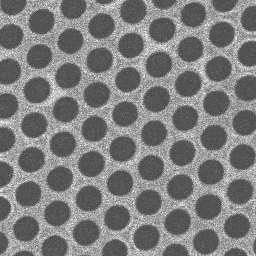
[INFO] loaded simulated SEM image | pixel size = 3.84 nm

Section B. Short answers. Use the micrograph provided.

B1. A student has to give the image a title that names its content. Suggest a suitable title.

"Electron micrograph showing a regular array of holes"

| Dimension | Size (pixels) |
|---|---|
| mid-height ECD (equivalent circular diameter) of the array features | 25.4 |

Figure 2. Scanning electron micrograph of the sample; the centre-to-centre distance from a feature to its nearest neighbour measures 132 nm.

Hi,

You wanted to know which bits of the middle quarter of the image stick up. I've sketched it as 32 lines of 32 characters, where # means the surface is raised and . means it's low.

...###......########.......#####
....###....###....###......#####
....#########......##.....###...
....#########......#########....
....#########......#########....
...###.....##......#########....
#####......###....###.....##....
#####......#########......###...
..###......#########......######
...##......####.####......######
....###..####.....##......####.#
....########......###....###....
...#########.......########.....
...###...###......#########.....
.####.....###.....###...###.....
#####......###..####.....###....
####.......########.......###..#
..###.....#########.......######
...##.....###....##......#######
...#########......##.....###...#
...########.......####.####.....
..#########.......#########.....
..###....###......########......
####......##.....###....###.....
####......#########......##.....
####......#########......#######
.###......########.......#######
..###....###....###.....########
..#########......###....###....#
..#########......#########......
.#####.####......#########......
####.....##......####.####......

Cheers